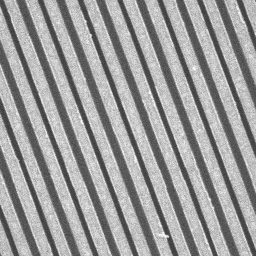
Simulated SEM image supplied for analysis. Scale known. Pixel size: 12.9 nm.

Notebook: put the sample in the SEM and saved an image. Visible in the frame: parallel lines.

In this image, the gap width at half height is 65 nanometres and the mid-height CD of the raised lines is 154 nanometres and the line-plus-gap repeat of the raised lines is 0.24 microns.